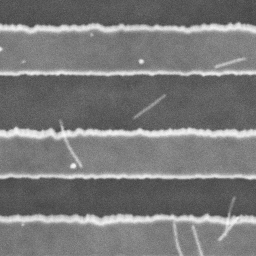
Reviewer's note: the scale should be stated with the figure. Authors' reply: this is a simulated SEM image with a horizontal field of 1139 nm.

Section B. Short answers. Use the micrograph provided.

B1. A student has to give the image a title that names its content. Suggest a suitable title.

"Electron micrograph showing lines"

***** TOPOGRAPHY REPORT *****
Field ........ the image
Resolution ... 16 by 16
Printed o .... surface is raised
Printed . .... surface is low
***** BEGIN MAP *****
................
................
oooooooooooooooo
oooooooooooooooo
oooooooooooooooo
................
................
................
oooooooooooooooo
oooooooooooooooo
oooooooooooooooo
................
................
................
oooooooooooooooo
oooooooooooooooo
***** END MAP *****